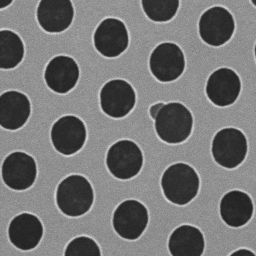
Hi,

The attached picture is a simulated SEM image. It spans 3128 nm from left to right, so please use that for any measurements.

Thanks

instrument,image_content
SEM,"a regular array of holes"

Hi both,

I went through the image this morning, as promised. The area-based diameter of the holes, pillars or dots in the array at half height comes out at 37.5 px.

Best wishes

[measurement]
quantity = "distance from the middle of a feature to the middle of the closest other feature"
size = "744 nm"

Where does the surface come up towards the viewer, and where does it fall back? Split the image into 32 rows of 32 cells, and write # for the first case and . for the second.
.####....#########....##########
#####....#########....####...###
#####....####..####..####....###
#####...####....#########....###
..##########....#########....###
...#########....####..####..####
...#########...####....#########
...###...##########....#########
..####....#########....#########
######....#########...####....##
######...####...##########....##
#.#####.#####....#########....##
....#########....#########...###
....#########....###...#########
....####.#####..####....########
...####...#########.....########
######.....#########....###...##
######.....#########...####....#
#######...####...#########.....#
#...#########.....#########....#
....#########.....####.####...##
.....#########...####...########
....####...#########.....#######
#..####....#########.....#######
#######.....#########...####...#
#######.....###...####.#####....
########...###....#########.....
##...#########.....#########...#
#....#########....####...#######
#....##########..####....#######
##...####...#########.....######
########.....########....####...